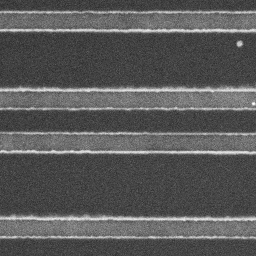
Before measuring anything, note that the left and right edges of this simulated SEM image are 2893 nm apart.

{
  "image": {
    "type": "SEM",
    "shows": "lines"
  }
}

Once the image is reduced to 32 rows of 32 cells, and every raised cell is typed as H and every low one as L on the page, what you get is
HHHHHHHHHHHHHHHHHHHHHHHHHHHHHHHH
HHHHHHHHHHHHHHHHHHHHHHHHHHHHHHHH
LLLLLLLLLLLLLLLLLLLLLLLLLLLLLLLL
LLLLLLLLLLLLLLLLLLLLLLLLLLLLLLLL
HHHHHHHHHHHHHHHHHHHHHHHHHHHHHHHH
HHHHHHHHHHHHHHHHHHHHHHHHHHHHHHHH
HHHHHHHHHHHHHHHHHHHHHHHHHHHHHHHH
HHHHHHHHHHHHHHHHHHHHHHHHHHHHHHHH
HHHHHHHHHHHHHHHHHHHHHHHHHHHHHHHH
HHHHHHHHHHHHHHHHHHHHHHHHHHHHHHHH
HHHHHHHHHHHHHHHHHHHHHHHHHHHHHHHH
LLLLLLLLLLLLLLLLLLLLLLLLLLLLLLLL
LLLLLLLLLLLLLLLLLLLLLLLLLLLLLLLL
LLLLLLLLLLLLLLLLLLLLLLLLLLLLLLLL
HHHHHHHHHHHHHHHHHHHHHHHHHHHHHHHH
HHHHHHHHHHHHHHHHHHHHHHHHHHHHHHHH
HHHHHHHHHHHHHHHHHHHHHHHHHHHHHHHH
LLLLLLLLLLLLLLLLLLLLLLLLLLLLLLLL
LLLLLLLLLLLLLLLLLLLLLLLLLLLLLLLL
HHHHHHHHHHHHHHHHHHHHHHHHHHHHHHHH
HHHHHHHHHHHHHHHHHHHHHHHHHHHHHHHH
HHHHHHHHHHHHHHHHHHHHHHHHHHHHHHHH
HHHHHHHHHHHHHHHHHHHHHHHHHHHHHHHH
HHHHHHHHHHHHHHHHHHHHHHHHHHHHHHHH
HHHHHHHHHHHHHHHHHHHHHHHHHHHHHHHH
HHHHHHHHHHHHHHHHHHHHHHHHHHHHHHHH
HHHHHHHHHHHHHHHHHHHHHHHHHHHHHHHH
LLLLLLLLLLLLLLLLLLLLLLLLLLLLLLLL
LLLLLLLLLLLLLLLLLLLLLLLLLLLLLLLL
LLLLLLLLLLLLLLLLLLLLLLLLLLLLLLLL
HHHHHHHHHHHHHHHHHHHHHHHHHHHHHHHH
HHHHHHHHHHHHHHHHHHHHHHHHHHHHHHHH